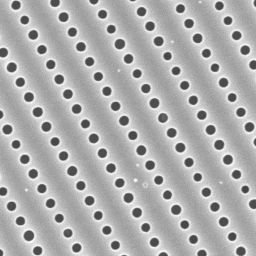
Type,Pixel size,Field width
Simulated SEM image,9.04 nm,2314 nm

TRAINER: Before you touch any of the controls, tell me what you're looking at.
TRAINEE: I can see a regular array of holes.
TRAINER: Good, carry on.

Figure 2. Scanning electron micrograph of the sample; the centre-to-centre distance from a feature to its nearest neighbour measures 154 nm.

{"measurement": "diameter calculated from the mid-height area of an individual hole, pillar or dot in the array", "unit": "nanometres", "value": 87.1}